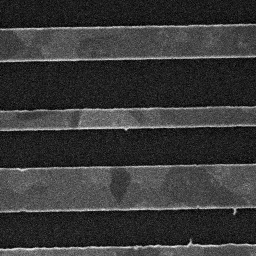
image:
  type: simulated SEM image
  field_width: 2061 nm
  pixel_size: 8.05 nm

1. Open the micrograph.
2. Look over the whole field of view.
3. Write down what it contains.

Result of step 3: one or a few lines or trenches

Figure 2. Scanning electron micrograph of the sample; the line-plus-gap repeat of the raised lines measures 584 nm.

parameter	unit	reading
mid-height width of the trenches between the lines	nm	309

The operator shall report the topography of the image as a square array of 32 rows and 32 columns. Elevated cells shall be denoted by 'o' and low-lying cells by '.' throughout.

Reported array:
................................
................................
................................
......ooo.o.oooooooooooooooooooo
oooooooooooooooooooooooooooooooo
oooooooooooooooooooooooooooooooo
oooooooooooooooooooooooooooooooo
ooooooooo.......................
................................
................................
................................
................................
................................
...................o....oooooooo
oooooooooooooooooooooooooooooooo
oooooooooooooooooooooooooooooooo
................................
................................
................................
................................
................................
oooooooooooooooooooooooooooooooo
oooooooooooooooooooooooooooooooo
oooooooooooooooooooooooooooooooo
oooooooooooooooooooooooooooooooo
oooooooooooooooooooooooooooooooo
................................
................................
................................
................................
................................
oooooooooooooooooooooooooooooooo